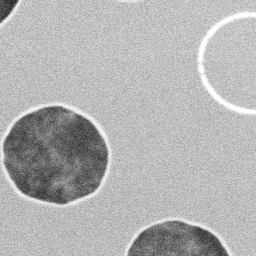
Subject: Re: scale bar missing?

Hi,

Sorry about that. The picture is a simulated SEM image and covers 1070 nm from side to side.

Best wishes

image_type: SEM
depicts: holes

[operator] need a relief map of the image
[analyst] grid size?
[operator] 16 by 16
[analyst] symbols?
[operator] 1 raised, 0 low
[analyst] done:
0111111111111111
1111111111111111
1111111111111111
1111111111111111
1111111111111111
1111111111111111
1111111111111111
1000001111111111
0000001111111111
0000000111111111
0000000111111111
1000001111111111
1100011111111111
1111111111111111
1111111110000111
1111111100000011